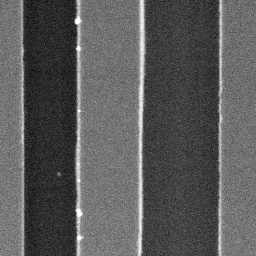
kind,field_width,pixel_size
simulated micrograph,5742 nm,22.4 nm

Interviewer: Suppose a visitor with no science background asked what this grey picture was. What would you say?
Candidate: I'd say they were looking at lines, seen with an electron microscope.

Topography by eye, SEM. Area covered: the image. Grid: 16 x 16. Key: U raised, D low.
UDDDDUUUUDDDDDUU
UDDDDUUUUDDDDDUU
UDDDDUUUUDDDDDUU
UDDDDUUUUDDDDDUU
UDDDDUUUUDDDDDUU
UDDDDUUUUDDDDDUU
UDDDDUUUUDDDDDUU
UDDDDUUUUDDDDDUU
UDDDDUUUUDDDDDUU
UDDDDUUUUDDDDDUU
UDDDDUUUUDDDDDUU
UDDDDUUUUDDDDDUU
UDDDDUUUUDDDDDUU
UDDDDUUUUDDDDDUU
UDDDDUUUUDDDDDUU
UDDDDUUUUDDDDDUU